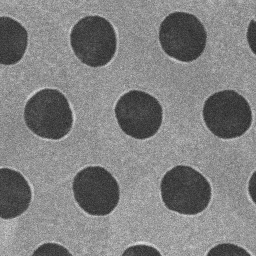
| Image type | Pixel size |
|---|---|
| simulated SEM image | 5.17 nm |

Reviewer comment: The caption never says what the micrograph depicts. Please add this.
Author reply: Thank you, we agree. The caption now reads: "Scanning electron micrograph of holes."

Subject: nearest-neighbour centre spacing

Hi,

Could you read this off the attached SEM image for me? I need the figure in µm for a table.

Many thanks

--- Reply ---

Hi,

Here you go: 0.449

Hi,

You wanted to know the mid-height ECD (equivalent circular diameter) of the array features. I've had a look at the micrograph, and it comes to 258 nm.